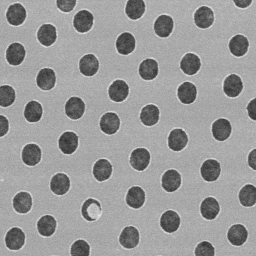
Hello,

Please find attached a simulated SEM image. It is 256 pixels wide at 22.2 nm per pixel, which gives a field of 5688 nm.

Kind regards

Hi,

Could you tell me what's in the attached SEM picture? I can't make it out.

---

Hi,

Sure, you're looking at a regular array of holes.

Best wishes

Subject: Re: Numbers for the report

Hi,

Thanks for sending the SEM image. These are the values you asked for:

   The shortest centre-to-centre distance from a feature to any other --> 847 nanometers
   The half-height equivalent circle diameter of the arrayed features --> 0.488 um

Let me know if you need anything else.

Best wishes